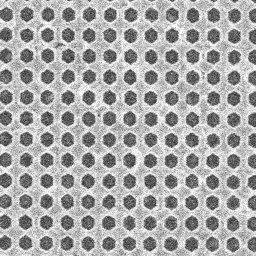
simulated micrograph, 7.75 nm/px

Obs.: a regular array of holes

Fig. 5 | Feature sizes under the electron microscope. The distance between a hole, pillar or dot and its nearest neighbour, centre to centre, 159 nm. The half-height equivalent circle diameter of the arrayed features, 114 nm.